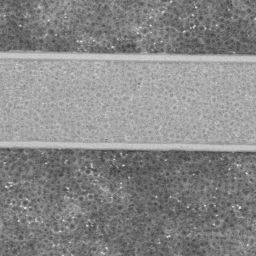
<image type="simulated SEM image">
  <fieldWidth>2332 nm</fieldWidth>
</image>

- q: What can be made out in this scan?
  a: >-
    one or a few lines or trenches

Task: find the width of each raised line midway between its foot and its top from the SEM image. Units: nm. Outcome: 798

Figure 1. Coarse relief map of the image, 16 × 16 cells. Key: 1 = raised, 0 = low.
0000000000000000
0000000000000000
0000000000000000
0000000000000000
1111111111111111
1111111111111111
1111111111111111
1111111111111111
1111111111111111
0000000000000000
0000000000000000
0000000000000000
0000000000000000
0000000000000000
0000000000000000
0000000000000000